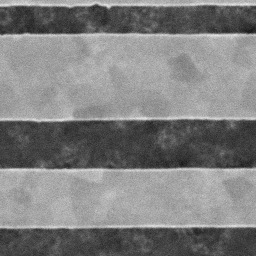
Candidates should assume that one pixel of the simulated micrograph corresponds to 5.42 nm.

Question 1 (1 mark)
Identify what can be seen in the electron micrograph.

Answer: one or a few lines or trenches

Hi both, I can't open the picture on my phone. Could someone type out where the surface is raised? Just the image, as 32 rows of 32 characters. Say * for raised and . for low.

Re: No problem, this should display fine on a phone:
********************************
................................
*...............................
................................
********************************
********************************
********************************
********************************
********************************
********************************
********************************
********************************
********************************
********************************
********************************
................................
................................
................................
................................
................................
................................
********************************
********************************
********************************
********************************
********************************
********************************
********************************
................................
................................
................................
................................